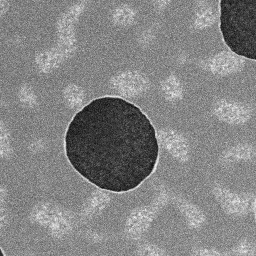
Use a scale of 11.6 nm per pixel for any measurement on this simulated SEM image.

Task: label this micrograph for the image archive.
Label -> holes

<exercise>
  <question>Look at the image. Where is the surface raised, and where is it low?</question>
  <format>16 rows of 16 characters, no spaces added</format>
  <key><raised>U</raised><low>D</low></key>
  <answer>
UUUUUUUUUUUUUUDD
UUUUUUUUUUUUUUDD
UUUUUUUUUUUUUUDD
UUUUUUUUUUUUUUUD
UUUUUUUUUUUUUUUU
UUUUUUUUUUUUUUUU
UUUUUUDDUUUUUUUU
UUUUUDDDDUUUUUUU
UUUUDDDDDDUUUUUU
UUUUDDDDDDUUUUUU
UUUUUDDDDDUUUUUU
UUUUUUDDDUUUUUUU
UUUUUUUUUUUUUUUU
UUUUUUUUUUUUUUUU
UUUUUUUUUUUUUUUU
UUUUUUUUUUUUUUUU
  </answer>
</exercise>